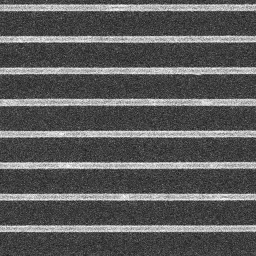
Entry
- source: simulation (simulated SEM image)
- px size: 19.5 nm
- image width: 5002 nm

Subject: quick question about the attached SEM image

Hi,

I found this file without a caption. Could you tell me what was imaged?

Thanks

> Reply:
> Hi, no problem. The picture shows parallel lines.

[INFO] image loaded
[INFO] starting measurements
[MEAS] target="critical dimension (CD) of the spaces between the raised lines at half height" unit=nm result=503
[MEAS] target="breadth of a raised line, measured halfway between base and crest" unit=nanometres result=117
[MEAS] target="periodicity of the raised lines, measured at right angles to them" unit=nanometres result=616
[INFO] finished